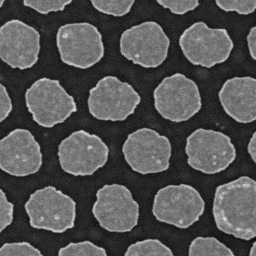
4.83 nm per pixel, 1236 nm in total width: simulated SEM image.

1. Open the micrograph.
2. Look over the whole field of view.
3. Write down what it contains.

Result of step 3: a regular array of raised bodies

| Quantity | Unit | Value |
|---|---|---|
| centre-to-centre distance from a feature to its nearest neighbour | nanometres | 297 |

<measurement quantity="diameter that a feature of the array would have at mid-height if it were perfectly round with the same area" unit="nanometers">223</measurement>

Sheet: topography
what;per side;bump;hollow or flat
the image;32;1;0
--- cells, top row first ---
00011111000011111000111110011111
00000100000001110000001000000010
00000000000000000000000000000000
11110000111100000111000011000000
11111001111100011111100111110001
11111001111110011111100111111001
11111001111110011111100111111001
11111000111100001111000011110000
00000000001000000000000000000000
00000000000000000000001000000000
00001110000011110000111100001111
10011111000111111001111110001111
10011111100111111001111110001111
10001111100111111000111110001111
10001111000011110000111100000111
00000110000000000000000000000000
00110000000000000110000011100000
11110000111110001111100111111001
11111001111110011111100111111001
11111001111110001111100111111001
11111000111110001111100011111000
01110000111100000111000001100000
00000000000000000000000000000011
00000010000001110000011100011111
10001111000011110000111110011111
10011111100011111001111110011111
11011111100011111001111110011111
10001111100011111000111110011111
10000111000001111000000000011111
00000000000000000000000000000111
01110000011000000111000011110000
11111000111110001111100011111001